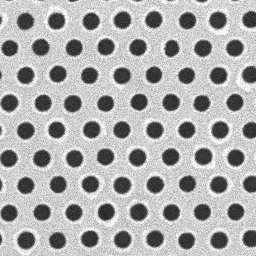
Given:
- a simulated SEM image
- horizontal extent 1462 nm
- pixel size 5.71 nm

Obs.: a regular array of holes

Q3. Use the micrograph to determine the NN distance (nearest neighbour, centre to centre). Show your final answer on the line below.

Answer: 0.177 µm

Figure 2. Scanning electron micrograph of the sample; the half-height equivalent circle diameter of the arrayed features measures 94.3 nanometers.